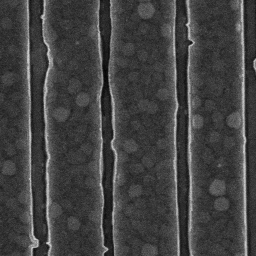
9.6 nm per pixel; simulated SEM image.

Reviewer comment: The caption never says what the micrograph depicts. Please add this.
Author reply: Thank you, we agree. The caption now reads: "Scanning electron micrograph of one or a few lines or trenches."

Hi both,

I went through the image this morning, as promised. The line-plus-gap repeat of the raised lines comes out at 686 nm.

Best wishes